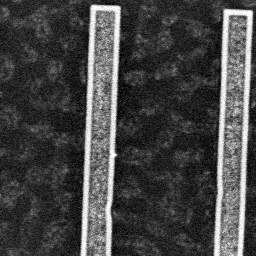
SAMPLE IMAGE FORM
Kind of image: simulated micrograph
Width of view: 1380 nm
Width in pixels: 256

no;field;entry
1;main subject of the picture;one or a few lines or trenches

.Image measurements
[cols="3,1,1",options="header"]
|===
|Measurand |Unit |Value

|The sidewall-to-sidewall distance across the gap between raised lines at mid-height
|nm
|584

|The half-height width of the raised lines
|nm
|132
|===